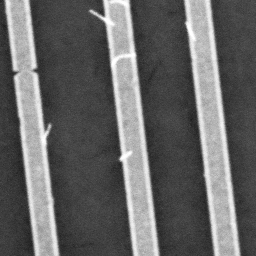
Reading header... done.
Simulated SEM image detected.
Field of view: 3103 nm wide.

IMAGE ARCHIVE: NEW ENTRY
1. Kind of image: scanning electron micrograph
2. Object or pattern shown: one or a few lines or trenches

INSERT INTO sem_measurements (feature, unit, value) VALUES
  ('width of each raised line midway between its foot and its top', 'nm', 251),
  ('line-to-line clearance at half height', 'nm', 823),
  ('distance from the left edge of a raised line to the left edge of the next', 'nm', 1090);